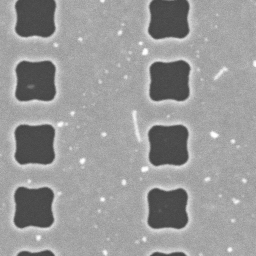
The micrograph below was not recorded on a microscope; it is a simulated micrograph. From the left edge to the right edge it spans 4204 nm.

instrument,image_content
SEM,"holes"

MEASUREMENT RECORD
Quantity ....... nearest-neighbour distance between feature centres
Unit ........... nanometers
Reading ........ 1040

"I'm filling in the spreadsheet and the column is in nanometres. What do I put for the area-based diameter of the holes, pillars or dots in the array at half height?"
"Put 732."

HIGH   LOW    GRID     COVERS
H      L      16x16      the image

HLLHHHHHHLLLHHHH
HLLHHHHHHLLLHHHH
HHHHHHHHHHHHHHHH
HHHHHHHHHHHHHHHH
HLLHHHHHHLLLHHHH
HLLHHHHHHLLLHHHH
HHHHHHHHHHHHHHHH
HHHHHHHHHHHHHHHH
HLLHHHHHHLLLHHHH
HLLHHHHHHLLLHHHH
HHHHHHHHHHHHHHHH
HHHHHHHHHHHHHHHH
HLLHHHHHHLLLHHHH
HLLHHHHHHLLLHHHH
HHHHHHHHHHHHHHHH
HHHHHHHHHHHHHHHH